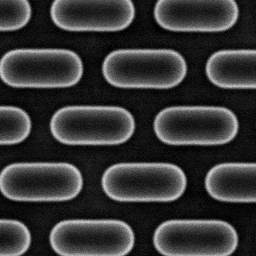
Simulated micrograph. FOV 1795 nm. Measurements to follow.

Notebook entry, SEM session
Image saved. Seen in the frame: groups of lines, slits or small figures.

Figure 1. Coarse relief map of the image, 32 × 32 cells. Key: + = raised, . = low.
+++....+++++++++....+++++++++...
++++...++++++++++...++++++++++..
+++....+++++++++....+++++++++...
++......+++++++......+++++++....
................................
................................
..+++++++......+++++++.......+++
++++++++++...++++++++++...++++++
++++++++++...++++++++++...++++++
++++++++++...++++++++++...++++++
.++++++++.....++++++++.....+++++
................................
................................
................................
+++....+++++++++....+++++++++...
++++...++++++++++..+++++++++++..
++++...+++++++++....+++++++++...
+++.....++++++++....+++++++++...
................................
................................
................................
++++++++++...++++++++++...++++++
++++++++++...++++++++++...++++++
++++++++++...++++++++++...++++++
.++++++++.....++++++++.....+++++
................................
................................
................................
+++....+++++++++....+++++++++...
++++..+++++++++++..++++++++++...
++++...+++++++++...++++++++++...
+++....+++++++++....+++++++++...